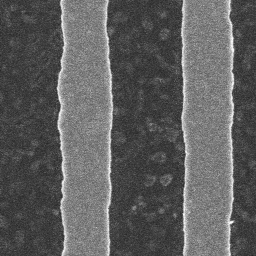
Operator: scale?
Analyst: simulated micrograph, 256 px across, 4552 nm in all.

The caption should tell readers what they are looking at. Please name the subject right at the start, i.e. one or a few lines or trenches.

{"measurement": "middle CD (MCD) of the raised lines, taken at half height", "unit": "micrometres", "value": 0.851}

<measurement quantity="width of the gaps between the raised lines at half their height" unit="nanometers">1310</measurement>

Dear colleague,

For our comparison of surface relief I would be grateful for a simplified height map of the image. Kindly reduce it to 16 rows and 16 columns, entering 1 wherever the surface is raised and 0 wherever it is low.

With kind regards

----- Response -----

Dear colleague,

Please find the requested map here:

0000111000011100
0000111000011100
0000111000011110
0000111000011110
0000111000011110
0000111000011110
0000111000011110
0000111000011110
0000111000011100
0000111000001110
0000111000001110
0000111000001110
0000111000011110
0000111000011100
0000111000001100
0000111000001100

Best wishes